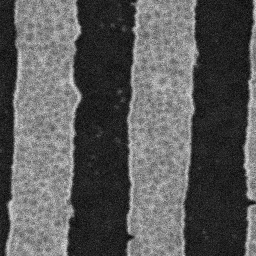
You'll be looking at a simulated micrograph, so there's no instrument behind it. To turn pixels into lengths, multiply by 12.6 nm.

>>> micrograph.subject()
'one or a few lines or trenches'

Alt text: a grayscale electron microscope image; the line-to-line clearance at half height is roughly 61.1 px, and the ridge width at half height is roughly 0.721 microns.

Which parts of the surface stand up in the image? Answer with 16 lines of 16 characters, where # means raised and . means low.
.####....###....
.####....###....
.####....###....
.####...####....
.###....####....
.####...####....
.####...####....
.####...####....
.###....####....
.###....####...#
.###....####...#
.###....####....
.###....###.....
.###....###.....
.###....###.....
.###....###....#